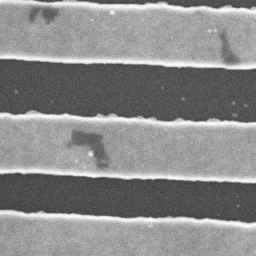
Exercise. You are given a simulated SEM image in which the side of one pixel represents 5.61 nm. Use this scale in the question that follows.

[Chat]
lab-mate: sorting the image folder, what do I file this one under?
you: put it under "lines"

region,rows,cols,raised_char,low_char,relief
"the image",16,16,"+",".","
+++++++++++++...
++++++++++++++++
++++++++++++++++
++++++++++++++++
................
................
................
+++++++++.......
++++++++++++++++
++++++++++++++++
++++++++++++++++
................
................
++++++..........
++++++++++++++++
++++++++++++++++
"